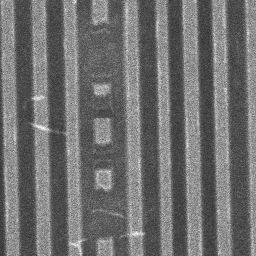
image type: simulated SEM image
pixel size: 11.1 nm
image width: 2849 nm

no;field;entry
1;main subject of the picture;parallel lines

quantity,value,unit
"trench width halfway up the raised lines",181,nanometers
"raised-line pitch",336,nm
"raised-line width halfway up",161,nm